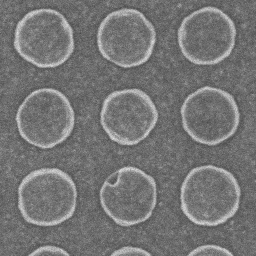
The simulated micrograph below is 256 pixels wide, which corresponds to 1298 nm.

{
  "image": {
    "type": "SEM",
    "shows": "a regular array of raised bodies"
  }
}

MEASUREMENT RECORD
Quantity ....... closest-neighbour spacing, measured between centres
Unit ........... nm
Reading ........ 403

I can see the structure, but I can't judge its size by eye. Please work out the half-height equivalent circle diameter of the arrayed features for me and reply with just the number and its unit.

55.1 px